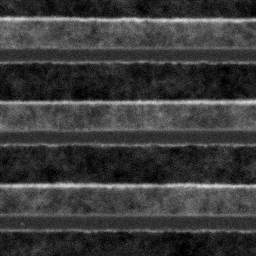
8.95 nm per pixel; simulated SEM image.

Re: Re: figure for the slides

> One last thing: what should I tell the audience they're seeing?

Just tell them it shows lines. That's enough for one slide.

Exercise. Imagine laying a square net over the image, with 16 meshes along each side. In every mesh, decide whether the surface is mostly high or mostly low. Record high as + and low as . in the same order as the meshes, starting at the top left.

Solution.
................
++++++++++++++++
++++++++++++++++
++++++++++++++++
................
................
++++++++++++++++
++++++++++++++++
++++++++++++++++
................
................
................
++++++++++++++++
++++++++++++++++
................
................